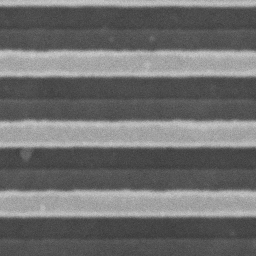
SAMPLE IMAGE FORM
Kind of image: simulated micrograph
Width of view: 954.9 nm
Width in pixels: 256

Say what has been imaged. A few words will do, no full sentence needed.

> lines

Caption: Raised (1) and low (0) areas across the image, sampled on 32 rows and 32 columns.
11111111111111111111111111111111
00000000000000000000000000000000
00000000000000000000000000000000
00000000000000000000000000000000
00000000000000000000000000000000
00000000000000000000000000000000
11111011111111111101111111111110
11111111111111111111111111111111
11111111111111111111111111111111
00111101110011000111011000000000
00000000000000000000000000000000
00000000000000000000000000000000
00000000000000000000000000000000
00000000000000000000000000000000
00000000000000000000000000000000
11111111111111111111111111111111
11111111111111111111111111111111
11111111111111111111111111111111
00000000000000000000000000000000
00000000000000000000000000000000
00000000000000000000000000000000
00000000000000000000000000000000
00000000000000000000000000000000
00000000000000000000000000000000
11111111111111111111111111111111
11111111111111111111111111111111
11111111111111111111111111111111
00000000000000000000000000000000
00000000000000000000000000000000
00000000000000000000000000000000
00000000000000000000000000000000
00000000000000000000000000000000